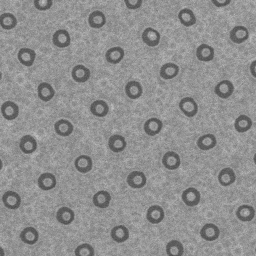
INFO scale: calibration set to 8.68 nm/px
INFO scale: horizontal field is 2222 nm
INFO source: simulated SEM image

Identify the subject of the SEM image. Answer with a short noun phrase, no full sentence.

a regular array of ring-shaped grooves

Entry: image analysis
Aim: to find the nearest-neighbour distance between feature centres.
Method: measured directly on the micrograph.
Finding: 338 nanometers